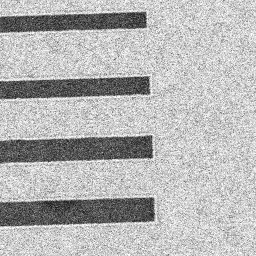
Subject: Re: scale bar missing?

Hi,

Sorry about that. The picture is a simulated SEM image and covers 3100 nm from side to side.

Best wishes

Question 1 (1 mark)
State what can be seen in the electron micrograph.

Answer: one or a few lines or trenches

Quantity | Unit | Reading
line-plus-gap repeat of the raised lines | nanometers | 762